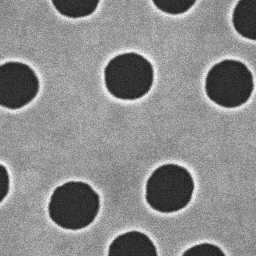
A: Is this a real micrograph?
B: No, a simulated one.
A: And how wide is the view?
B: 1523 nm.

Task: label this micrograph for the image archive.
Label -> holes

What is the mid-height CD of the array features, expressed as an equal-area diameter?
292 nanometres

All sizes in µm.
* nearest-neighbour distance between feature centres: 0.588